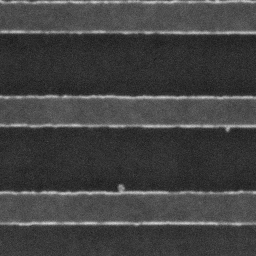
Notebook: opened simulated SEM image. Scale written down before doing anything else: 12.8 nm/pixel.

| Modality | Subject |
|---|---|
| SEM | lines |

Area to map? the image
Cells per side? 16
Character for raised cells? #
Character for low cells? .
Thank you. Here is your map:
################
################
................
................
................
................
################
################
................
................
................
................
################
################
................
................